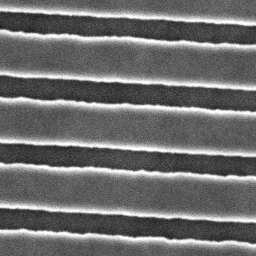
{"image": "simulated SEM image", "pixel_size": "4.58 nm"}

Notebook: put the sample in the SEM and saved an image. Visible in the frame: lines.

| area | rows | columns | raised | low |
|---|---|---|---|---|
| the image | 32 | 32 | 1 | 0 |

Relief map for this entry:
11111111111111111111111111111111
00011111111111111111111111111111
00000000000000000000011111111111
00000000000000000000000000000000
11111111110000000000000000000000
11111111111111111111111111011000
11111111111111111111111111111111
11111111111111111111111111111111
11111111111111111111111111111111
01111111111111111111111111111111
00000000000000000000111111111111
00000000000000000000000000000000
11110000000000000000000000000000
11111111111111111111111100000000
11111111111111111111111111111111
11111111111111111111111111111111
11111111111111111111111111111111
11111111111111111111111111111111
00000000000000011111111111111111
00000000000000000000000000000011
00000000000000000000000000000000
11111111111111111100000000000000
11111111111111111111111111111111
11111111111111111111111111111111
11111111111111111111111111111111
11111111111111111111111111111111
00000000001111111111111111111111
00000000000000000000000000011111
00000000000000000000000000000000
11111111111111000000000000000000
11111111111111111111111111111110
11111111111111111111111111111111